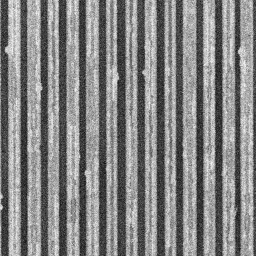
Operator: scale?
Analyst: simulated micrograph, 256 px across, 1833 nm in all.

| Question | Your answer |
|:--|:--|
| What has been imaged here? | parallel lines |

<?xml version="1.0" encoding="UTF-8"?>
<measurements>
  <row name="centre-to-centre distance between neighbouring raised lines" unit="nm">139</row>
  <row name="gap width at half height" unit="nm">69.8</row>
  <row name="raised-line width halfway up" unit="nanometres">69.8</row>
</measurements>